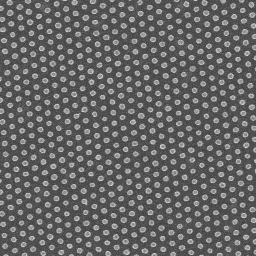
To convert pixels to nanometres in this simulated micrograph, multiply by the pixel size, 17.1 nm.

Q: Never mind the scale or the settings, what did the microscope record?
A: a regular array of raised bodies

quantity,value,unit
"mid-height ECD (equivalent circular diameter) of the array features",86.3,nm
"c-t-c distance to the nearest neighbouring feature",176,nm